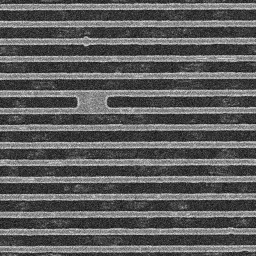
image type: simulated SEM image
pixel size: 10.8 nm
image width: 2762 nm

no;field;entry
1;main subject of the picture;parallel lines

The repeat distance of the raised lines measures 187 nanometres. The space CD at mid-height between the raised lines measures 129 nanometres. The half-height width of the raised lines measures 0.0593 micrometres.